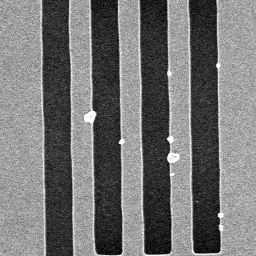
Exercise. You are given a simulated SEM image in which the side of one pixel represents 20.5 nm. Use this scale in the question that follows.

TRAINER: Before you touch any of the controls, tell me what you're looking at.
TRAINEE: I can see groups of lines, slits or small figures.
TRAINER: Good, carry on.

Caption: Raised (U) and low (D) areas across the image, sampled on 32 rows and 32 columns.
UUUUUDDDDUUDDDDUUDDDDUUUDDDUUUUU
UUUUUDDDDUUDDDDUUDDDDUUUDDDUUUUU
UUUUUDDDDUUDDDDUUDDDDUUUDDDUUUUU
UUUUUDDDDUUDDDDUUDDDDUUUDDDUUUUU
UUUUUDDDDUUDDDDUUDDDDUUUDDDUUUUU
UUUUUDDDDUUDDDDUUDDDDUUUDDDUUUUU
UUUUUDDDDUUDDDDUUUDDDUUUDDDUUUUU
UUUUUDDDDUUDDDDUUUDDDUUUDDDUUUUU
UUUUUDDDDUUDDDDUUUDDDUUUDDDUUUUU
UUUUUDDDDUUDDDDUUUDDDUUUDDDUUUUU
UUUUUDDDDUUDDDDUUUDDDUUUDDDUUUUU
UUUUUDDDDUUDDDDUUUDDDUUUDDDUUUUU
UUUUUDDDDUUDDDDUUUDDDUUUDDDUUUUU
UUUUUDDDDUUDDDDUUUDDDUUUDDDUUUUU
UUUUUDDDDUUUDDDUUUDDDUUUDDDUUUUU
UUUUUDDDDUUUDDDUUUDDDUUUDDDUUUUU
UUUUUDDDDUUUDDDUUUDDDUUUDDDUUUUU
UUUUUDDDDUUUDDDUUUDDDUUUDDDUUUUU
UUUUUDDDDUUUDDDUUUDDDUUUDDDUUUUU
UUUUUDDDDUUUDDDUUUDDDUUUDDDUUUUU
UUUUUDDDDUUUDDDUUUDDDUUUDDDUUUUU
UUUUUDDDDUUUDDDUUUDDDUUUDDDDUUUU
UUUUUDDDDUUUDDDUUUDDDUUUDDDDUUUU
UUUUUUDDDUUUDDDUUUDDDUUUDDDDUUUU
UUUUUUDDDUUUDDDUUUDDDUUUDDDDUUUU
UUUUUUDDDUUUDDDUUUDDDUUUDDDDUUUU
UUUUUUDDDUUUDDDUUUDDDUUUDDDUUUUU
UUUUUUDDDUUUDDDUUUDDDDUUDDDUUUUU
UUUUUUDDDUUUDDDUUUDDDDUUDDDUUUUU
UUUUUUDDDUUUDDDUUUDDDDUUDDDDUUUU
UUUUUUDDDUUUDDDUUUDDDDUUDDDDUUUU
UUUUUUDDDUUUDDDUUUDDDUUUDDDUUUUU